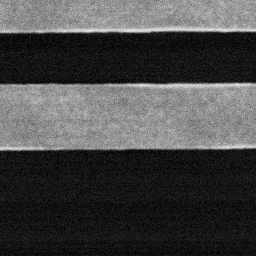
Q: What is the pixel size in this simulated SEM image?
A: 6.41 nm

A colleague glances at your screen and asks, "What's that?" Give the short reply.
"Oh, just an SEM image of wiring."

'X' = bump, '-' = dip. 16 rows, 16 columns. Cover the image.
XXXXXXXXXXXXXXXX
XXXXXXXXXXXXXXXX
----------------
----------------
----------------
XXXXXXXXXXXXXXXX
XXXXXXXXXXXXXXXX
XXXXXXXXXXXXXXXX
XXXXXXXXXXXXXXXX
----------------
----------------
----------------
----------------
----------------
----------------
----------------